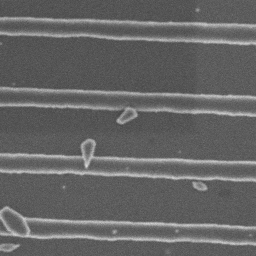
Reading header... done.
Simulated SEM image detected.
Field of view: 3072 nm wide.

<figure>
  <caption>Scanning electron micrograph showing lines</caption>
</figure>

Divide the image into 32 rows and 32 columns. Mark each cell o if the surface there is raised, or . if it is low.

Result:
................................
................................
oooooooo.oo.....................
oooooooooooooooooooooooooooooooo
........o..ooooooooooooooooooooo
................................
................................
................................
................................
................................
................................
oooooooooooo....................
oooooooooooooooooooooooooooooooo
...........ooooooooooooooooooooo
...............oo...............
................................
................................
................................
..........oo....................
oooooooo..oo....................
oooooooooooooooooooooooooooooooo
....oooooooooooooooooooooooooooo
.............................ooo
................................
................................
................................
oo..............................
oooooo..........................
oooooooooooooooooooooooooooooooo
..oooooooooooooooooooooooooooooo
.............................ooo
................................